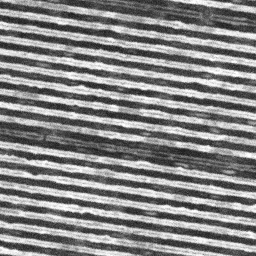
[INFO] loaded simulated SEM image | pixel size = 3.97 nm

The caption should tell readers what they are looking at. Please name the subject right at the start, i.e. parallel lines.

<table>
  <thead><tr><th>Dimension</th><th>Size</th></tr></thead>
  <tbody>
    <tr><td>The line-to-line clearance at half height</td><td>30.4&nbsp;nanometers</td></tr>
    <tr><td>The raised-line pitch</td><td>52.1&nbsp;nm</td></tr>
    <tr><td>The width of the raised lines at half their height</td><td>20.1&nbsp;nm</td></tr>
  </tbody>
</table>